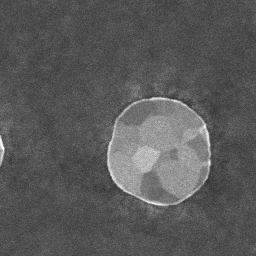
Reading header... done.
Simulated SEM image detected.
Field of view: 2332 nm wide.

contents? raised bodies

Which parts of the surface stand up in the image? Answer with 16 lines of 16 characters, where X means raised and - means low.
----------------
----------------
----------------
----------------
----------------
----------------
--------XXX-----
-------XXXXXX---
-------XXXXXX---
-------XXXXXX---
-------XXXXXX---
-------XXXXXX---
---------XX-----
----------------
----------------
----------------